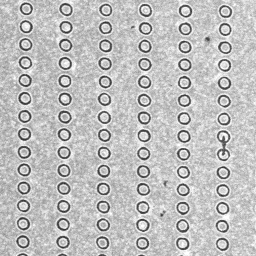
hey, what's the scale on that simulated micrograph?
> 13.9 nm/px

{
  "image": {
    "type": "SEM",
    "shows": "a regular array of ring-shaped grooves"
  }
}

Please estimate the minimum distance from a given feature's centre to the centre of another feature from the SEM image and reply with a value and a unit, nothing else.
245 nanometres